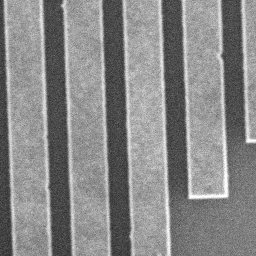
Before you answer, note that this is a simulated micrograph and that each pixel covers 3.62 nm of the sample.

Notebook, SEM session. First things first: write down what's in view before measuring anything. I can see parallel lines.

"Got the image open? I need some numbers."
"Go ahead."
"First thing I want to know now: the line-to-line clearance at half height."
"78.3 nm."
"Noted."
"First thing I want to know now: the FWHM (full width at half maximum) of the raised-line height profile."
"137 nm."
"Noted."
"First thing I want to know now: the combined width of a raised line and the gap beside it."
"215 nm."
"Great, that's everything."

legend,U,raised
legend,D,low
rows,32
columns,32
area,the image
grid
DUUUUDDDUUUUUDDUUUUUDDDUUUUDDDUU
DUUUUDDDUUUUUDDUUUUUDDDUUUUUDDUU
DUUUUDDDUUUUUDDDUUUUDDDUUUUUDDUU
DUUUUDDDUUUUUDDDUUUUDDDUUUUUDDUU
DUUUUDDDUUUUUDDDUUUUDDDUUUUUDDDU
DUUUUDDDUUUUUDDDUUUUDDDUUUUUDDUU
DUUUUDDDUUUUUDDDUUUUDDDUUUUUDDUU
DUUUUDDDUUUUUDDDUUUUDDDUUUUUDDDU
DUUUUUDDUUUUUDDDUUUUDDDUUUUUDDDU
DUUUUUDDUUUUUDDDUUUUDDDUUUUUDDDU
DUUUUUDDUUUUUDDDUUUUDDDUUUUUDDDU
DUUUUUDDUUUUUDDDUUUUDDDUUUUUDDDU
DUUUUUDDUUUUUDDDUUUUDDDUUUUUDDDU
DUUUUUDDUUUUUDDDUUUUUDDUUUUUDDDU
DUUUUUDDDUUUUDDDUUUUUDDUUUUUDDDU
DUUUUUDDDUUUUDDDUUUUUDDUUUUUDDDU
DUUUUUDDDUUUUDDDUUUUUDDUUUUUDDDU
DUUUUUDDDUUUUDDDUUUUUDDUUUUUDDDU
DUUUUUDDDUUUUDDDUUUUUDDUUUUUDDDD
DUUUUUDDDUUUUDDDUUUUUDDDUUUUDDDD
DUUUUUDDDUUUUDDDUUUUUDDDUUUUDDDD
DUUUUUDDDUUUUDDDUUUUUDDDUUUUDDDD
DUUUUUDDDUUUUDDDUUUUUDDDUUUUDDDD
DUUUUUDDDUUUUDDDUUUUUDDDUUUUDDDD
DUUUUUDDDUUUUDDDUUUUUDDDUUUUDDDD
DUUUUUDDDUUUUUDDUUUUUDDDDDDDDDDD
DDUUUUDDDUUUUUDDUUUUUDDDDDDDDDDD
DDUUUUDDDUUUUUDDUUUUUDDDDDDDDDDD
DDUUUUDDDUUUUUDDDUUUUDDDDDDDDDDD
DDUUUUDDDUUUUUDDUUUUUDDDDDDDDDDD
DDUUUUDDDUUUUUDDUUUUUDDDDDDDDDDD
DDUUUUDDDUUUUUDDDUUUUDDDDDDDDDDD